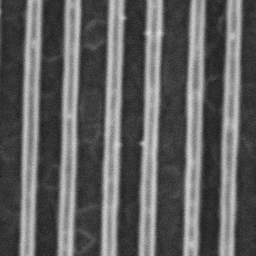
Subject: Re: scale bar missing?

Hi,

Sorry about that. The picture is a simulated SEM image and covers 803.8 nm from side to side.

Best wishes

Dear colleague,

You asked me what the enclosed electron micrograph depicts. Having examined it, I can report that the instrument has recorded parallel lines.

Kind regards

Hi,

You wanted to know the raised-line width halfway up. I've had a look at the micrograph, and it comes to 11.2 pixels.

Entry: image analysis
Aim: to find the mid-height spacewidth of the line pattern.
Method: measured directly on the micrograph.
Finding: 27.2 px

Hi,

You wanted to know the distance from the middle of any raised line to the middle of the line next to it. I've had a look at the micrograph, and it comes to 125 nanometres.